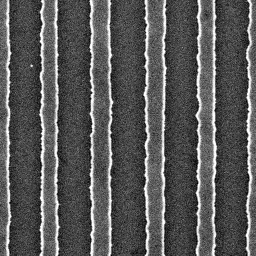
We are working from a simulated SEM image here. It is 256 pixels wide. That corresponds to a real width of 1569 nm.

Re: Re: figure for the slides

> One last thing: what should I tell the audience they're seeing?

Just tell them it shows lines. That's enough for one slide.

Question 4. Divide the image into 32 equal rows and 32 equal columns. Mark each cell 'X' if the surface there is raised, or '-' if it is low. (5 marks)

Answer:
X----XX----XXX----XXX----XX----X
X----XX----XXX----XXX----XX----X
X----XX----XXX----XXX----XX----X
X----XX----XXX----XXX----XX----X
X----XX----XXX----XXX----XX----X
X----XX----XXX----XXX----XX----X
X----XX----XXX----XXX----XX----X
X----XX----XXX----XXX----XX----X
X----XX----XXX----XXX----XX----X
X----XX----XXX----XXX----XX----X
X----XX----XXX----XXX----XX----X
X----XX----XXX----XXX----XX----X
X----XX----XXX----XXX----XX----X
X----XX----XXX----XXX----XX----X
X----XX----XXX----XXX----XX----X
X----XX-----XX----XXX----XX----X
X----XX----XXX----XXX----XX----X
X----XX----XXX----XX-----XX----X
X----XX----XXX----XX-----XX----X
X----XX----XXX----XXX----XX----X
X----XX----XXX----XXX----XX----X
X----XX----XXX----XX-----XX----X
X----XX----XXX----XXX----XX----X
X----XX----XXX----XXX----XX----X
X----XX----XXX----XXX----XX----X
X----XX-----XX----XXX----XX----X
X----XX----XXX----XXX----XX----X
X----XX----XXX----XXX----XX----X
X----XX-----XX----XX-----XX----X
X----XX----XXX----XX-----XX----X
X----XX----XXX----XX-----XX----X
X----XX----XXX----XXX----XX----X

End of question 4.